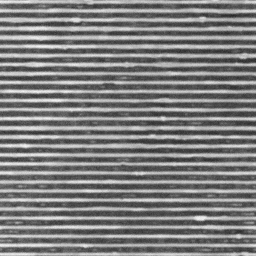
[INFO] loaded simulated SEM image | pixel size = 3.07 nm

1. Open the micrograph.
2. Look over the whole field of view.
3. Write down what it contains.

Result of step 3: parallel lines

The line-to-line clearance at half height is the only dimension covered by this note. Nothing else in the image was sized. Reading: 19.2 nanometers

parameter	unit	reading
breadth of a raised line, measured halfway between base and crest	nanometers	8.4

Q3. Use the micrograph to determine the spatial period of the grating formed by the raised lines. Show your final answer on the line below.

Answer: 0.0277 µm